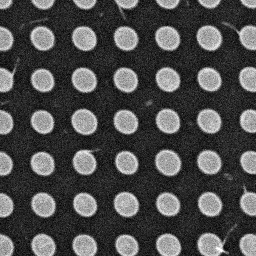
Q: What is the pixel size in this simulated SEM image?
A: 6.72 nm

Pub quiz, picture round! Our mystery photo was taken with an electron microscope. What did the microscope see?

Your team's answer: a regular array of raised bodies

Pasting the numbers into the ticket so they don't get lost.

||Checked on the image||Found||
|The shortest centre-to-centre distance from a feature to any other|278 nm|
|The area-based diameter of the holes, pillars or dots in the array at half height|23.9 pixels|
